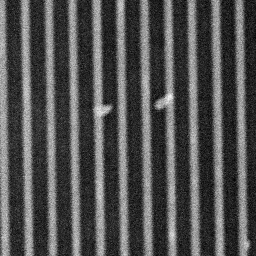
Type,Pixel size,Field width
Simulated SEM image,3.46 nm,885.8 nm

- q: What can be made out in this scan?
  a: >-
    parallel lines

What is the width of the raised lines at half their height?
19.5 nanometers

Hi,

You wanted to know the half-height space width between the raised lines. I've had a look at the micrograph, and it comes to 62.4 nanometers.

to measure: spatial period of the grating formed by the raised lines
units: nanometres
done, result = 82.3